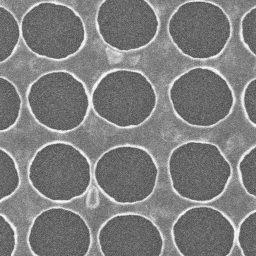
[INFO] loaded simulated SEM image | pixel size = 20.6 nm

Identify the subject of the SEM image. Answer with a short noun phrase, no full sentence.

a regular array of holes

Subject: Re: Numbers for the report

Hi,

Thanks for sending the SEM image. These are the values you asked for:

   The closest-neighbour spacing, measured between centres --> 1380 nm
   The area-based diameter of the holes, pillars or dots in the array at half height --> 1.23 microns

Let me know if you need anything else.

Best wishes